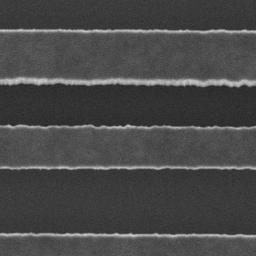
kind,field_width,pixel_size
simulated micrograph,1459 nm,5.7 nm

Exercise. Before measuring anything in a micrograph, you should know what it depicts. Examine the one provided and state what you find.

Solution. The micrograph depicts lines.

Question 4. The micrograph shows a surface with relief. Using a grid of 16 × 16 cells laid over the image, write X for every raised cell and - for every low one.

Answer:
----------------
----------------
XXXXXXXXXXXXXXXX
XXXXXXXXXXXXXXXX
XXXXXXXXXXXXXXXX
----------------
----------------
----------------
XXXXXXXXXXXXXXXX
XXXXXXXXXXXXXXXX
XXXXXXXXXXXXXXXX
----------------
----------------
----------------
----------------
XXXXXXXXXXXXXXXX